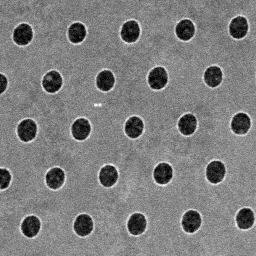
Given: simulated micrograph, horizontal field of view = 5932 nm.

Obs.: a regular array of raised bodies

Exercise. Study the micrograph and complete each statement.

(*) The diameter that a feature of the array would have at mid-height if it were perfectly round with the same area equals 517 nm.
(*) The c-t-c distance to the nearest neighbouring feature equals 1240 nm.